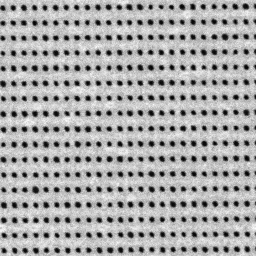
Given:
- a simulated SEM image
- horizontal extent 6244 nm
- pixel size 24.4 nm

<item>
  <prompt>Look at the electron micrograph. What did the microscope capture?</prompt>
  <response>a regular array of holes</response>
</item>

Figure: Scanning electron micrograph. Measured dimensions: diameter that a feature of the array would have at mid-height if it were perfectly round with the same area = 148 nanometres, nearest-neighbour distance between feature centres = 10.4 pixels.